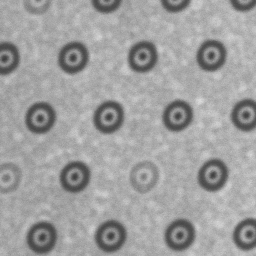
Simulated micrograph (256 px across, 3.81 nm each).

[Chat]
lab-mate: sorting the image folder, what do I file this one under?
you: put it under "a regular array of ring-shaped grooves with a dot in the middle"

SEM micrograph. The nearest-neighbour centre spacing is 260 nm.